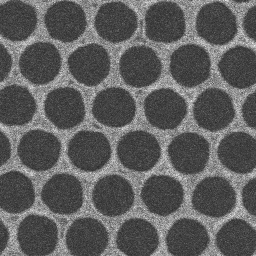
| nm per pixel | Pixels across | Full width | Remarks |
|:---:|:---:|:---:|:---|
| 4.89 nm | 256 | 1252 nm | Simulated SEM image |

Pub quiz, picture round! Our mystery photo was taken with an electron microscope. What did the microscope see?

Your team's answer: a regular array of holes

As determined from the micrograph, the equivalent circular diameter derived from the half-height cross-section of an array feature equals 207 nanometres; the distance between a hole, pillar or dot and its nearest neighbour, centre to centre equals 0.241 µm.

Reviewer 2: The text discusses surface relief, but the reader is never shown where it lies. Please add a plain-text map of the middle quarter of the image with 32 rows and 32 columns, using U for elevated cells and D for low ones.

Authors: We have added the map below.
UDDDDDDDDDDDUUDDDDDDDDDDDUDDDDDD
UDDDDDDDDDDUUUDDDDDDDDDDDUDDDDDD
UUDDDDDDDDDUUUDDDDDDDDDDUUUDDDDD
UUUDDDDDDDUUUUUDDDDDDDDUUUUDDDDD
UUUDDDDDDUUUUUUDDDDDDDDUUUUUDDDD
UUUUUUDDUUUUUUUUUDDDDUUUUUUUUUDD
DDDUUUUUUUDDDDDDUUUUUUUDDDDUUUUU
DDDDUUUUDDDDDDDDDUUUUDDDDDDDUUUU
DDDDDUUUDDDDDDDDDUUUDDDDDDDDDDUU
DDDDDUUDDDDDDDDDDDUUDDDDDDDDDDUU
DDDDDUUDDDDDDDDDDDUUDDDDDDDDDDDU
DDDDDUUDDDDDDDDDDDUUDDDDDDDDDDDU
DDDDDUUDDDDDDDDDDDUUDDDDDDDDDDDU
DDDDDUUUDDDDDDDDDUUUUDDDDDDDDDUU
DDDDUUUUUDDDDDDDDUUUUDDDDDDDDUUU
DDDUUUUUUUDDDDDUUUUUUUDDDDDDUUUU
UUUUUUUUUUUUUUUUUUUUUUUUUUUUUUUU
UUUDDDDDDDUUUUUUDDDDDDUUUUUUUDDD
UUDDDDDDDDDUUUDDDDDDDDDUUUUDDDDD
UDDDDDDDDDDUUUDDDDDDDDDDUUUDDDDD
UDDDDDDDDDDUUDDDDDDDDDDDUUDDDDDD
UDDDDDDDDDDDUDDDDDDDDDDDUUDDDDDD
UDDDDDDDDDDDUDDDDDDDDDDDUUDDDDDD
UDDDDDDDDDDDUUDDDDDDDDDDUUDDDDDD
UUDDDDDDDDDUUUDDDDDDDDDUUUUDDDDD
UUUDDDDDDDUUUUUDDDDDDDUUUUUDDDDD
UUUUDDDDDUUUUUUUUDDDDUUUUUUUDDDD
DUUUUUUUUUUUUUUUUUUUUUUUUUUUUUDD
DDDUUUUUUDDDDDDUUUUUUDDDDDDUUUUU
DDDDUUUUDDDDDDDDUUUUDDDDDDDDDUUU
DDDDUUUUDDDDDDDDDUUUDDDDDDDDDUUU
DDDDDUUDDDDDDDDDDUUDDDDDDDDDDDUU